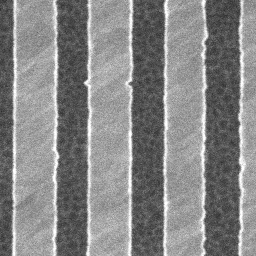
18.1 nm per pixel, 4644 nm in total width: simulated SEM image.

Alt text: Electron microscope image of one or a few lines or trenches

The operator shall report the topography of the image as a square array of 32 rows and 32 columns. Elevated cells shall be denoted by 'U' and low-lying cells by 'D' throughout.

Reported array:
DDUUUUUDDDDUUUUUDDDDDUUUUDDDDDUU
DDUUUUUDDDDUUUUUUDDDDUUUUUDDDDUU
DDUUUUUDDDDUUUUUDDDDDUUUUUDDDDUU
DDUUUUUDDDDUUUUUDDDDDUUUUUDDDDUU
DDUUUUUDDDDUUUUUDDDDDUUUUUDDDDUU
DDUUUUUDDDDUUUUUDDDDDUUUUUDDDDUU
DDUUUUUDDDDUUUUUDDDDDUUUUUDDDDUU
DDUUUUUDDDDUUUUUDDDDDUUUUUDDDDUU
DDUUUUUDDDDUUUUUDDDDDUUUUUDDDDUU
DDUUUUUDDDDUUUUUDDDDDUUUUUDDDDUU
DDUUUUUDDDDUUUUUDDDDDUUUUUDDDDUU
DDUUUUUDDDDUUUUUDDDDDUUUUDDDDDUU
DDUUUUUDDDDUUUUUDDDDDUUUUUDDDDUU
DDUUUUUDDDDUUUUUDDDDDUUUUUDDDDUU
DDUUUUUDDDDUUUUUDDDDDUUUUDDDDDUU
DDUUUUUDDDDUUUUUDDDDDUUUUDDDDDUU
DDUUUUUDDDDUUUUUDDDDDUUUUDDDDDUU
DDUUUUUDDDDUUUUUDDDDDUUUUDDDDDUU
DDUUUUUDDDDUUUUUDDDDDUUUUDDDDDUU
DDUUUUUDDDDUUUUUDDDDDUUUUDDDDDUU
DDUUUUUDDDDUUUUUDDDDDUUUUDDDDDUU
DDUUUUUDDDDUUUUUDDDDDUUUUDDDDDUU
DDUUUUUDDDDUUUUUDDDDDUUUUDDDDDUU
DDUUUUUDDDDUUUUUDDDDDUUUUDDDDDUU
DDUUUUUDDDDUUUUUDDDDDUUUUUDDDDUU
DDUUUUUDDDDUUUUUDDDDDUUUUDDDDDUU
DDUUUUUDDDDUUUUUDDDDDUUUUUDDDDUU
DDUUUUUDDDDUUUUUDDDDDUUUUDDDDDUU
DDUUUUUDDDDUUUUUDDDDDUUUUDDDDDUU
DDUUUUUDDDDUUUUUDDDDDUUUUUDDDDUU
DDUUUUUDDDDUUUUUDDDDDUUUUDDDDDUU
DDUUUUUDDDDUUUUUDDDDDUUUUUDDDDUU